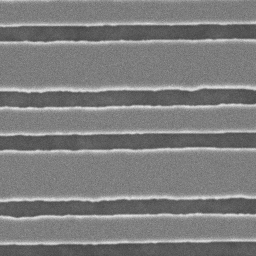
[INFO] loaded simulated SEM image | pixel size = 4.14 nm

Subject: lines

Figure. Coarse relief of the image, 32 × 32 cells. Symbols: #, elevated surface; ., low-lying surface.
################################
################################
################################
................................
................................
################################
################################
################################
################################
################################
################################
...#............................
................................
################################
################################
################################
############################....
................................
.......................####.....
################################
################################
################################
################################
################################
################################
................................
................................
################################
################################
################################
########..##....................
................................